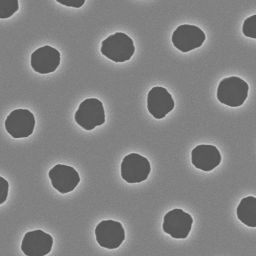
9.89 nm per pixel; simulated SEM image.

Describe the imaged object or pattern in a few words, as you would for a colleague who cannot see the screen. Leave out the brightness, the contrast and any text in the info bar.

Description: a regular array of holes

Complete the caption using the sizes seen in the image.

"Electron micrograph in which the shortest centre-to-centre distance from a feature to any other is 0.683 um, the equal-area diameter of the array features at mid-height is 293 nanometers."